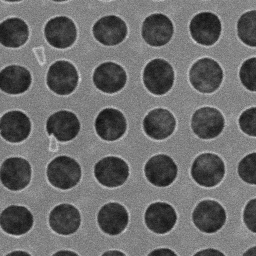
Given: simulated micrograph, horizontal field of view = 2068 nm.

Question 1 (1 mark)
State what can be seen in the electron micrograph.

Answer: a regular array of holes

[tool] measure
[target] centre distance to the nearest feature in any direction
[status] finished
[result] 46.8 pixels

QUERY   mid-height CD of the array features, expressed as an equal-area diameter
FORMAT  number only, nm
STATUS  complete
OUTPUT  267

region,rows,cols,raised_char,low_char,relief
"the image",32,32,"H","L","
HHHHHHHHHHHHHHHHHHHHHHHHHHHHHHHH
HHHHHHHHHHHHHHHHHHHHHHHHHHHHHHHL
HLLHHHLLLHHHLLLHHHLLLHHHLLLHHHLL
LLLHHHLLLLHHLLLLHHLLLLHHLLLLHHLL
LLLHHHLLLLHHLLLLHHLLLLHHLLLHHHLL
LLLHHHLLLHHHHLLHHHHLLHHHHLLHHHHL
HHHHHHHHHHHHHHHHHHHHHHHHHHHHHHHH
HHHHHHHHHHHHHHHHHHHLLHHHHLLHHHHL
HLLHHHLLLHHHLLLHHHLLLLHHLLLLHHLL
LLLLHHLLLLHHLLLLHHLLLLHHLLLLHHLL
LLLLHHLLLLHHLLLLHHLLLLHHLLLLHHLL
HLLHHHHLLHHHHLLHHHHLLHHHHLLHHHHH
HHHHHHHHHHHHHHHHHHHHHHHHHHHHHHHH
HHHHHHHHHHHHHHHHHHHHHHHHHLLHHHHL
LLLHHHLLLHHHLLLHHHLLLLHHLLLLHHLL
LLLLHHLLLLHHLLLLHHLLLLHHLLLLHHLL
LLLLHHLLLLHHLLLLHHLLLLHHLLLLHHLL
HLLHHHHLLHHHHLHHHHHHHHHHHHHHHHHH
HHHHHHHHHHHHHHHHHHHHHHHHHHHHHHHH
HHHHHHHLHHHHHHHHHHHLLHHHHLLHHHHL
LLLLHHLLLLHHLLLLHHLLLLHHLLLLHHLL
LLLLHHLLLLHHLLLLHHLLLLHHLLLLHHLL
LLLLHHLLLLHHLLLLHHLLLLHHLLLLHHLL
HLLHHHHLLHHHHHHHHHHHHHHHHHHHHHHH
HHHHHHHHHHHHHHHHHHHHHHHHHHHHHHHH
HHHHHHHHLHHHHLLHHHHLLHHHHLLHHHHL
LLLLHHLLLLHHLLLLHHLLLLHHLLLLHHLL
LLLLHHLLLLHHLLLLHHLLLLHHLLLLHHLL
LLLLHHLLLLHHHLLLHHHLLLHHHLLLHHHL
HHHHHHHHHHHHHHHHHHHHHHHHHHHHHHHH
HHHHHHHHHHHHHHHHHHHHHHHHHHHHHHHH
HHLHHHHLLHHHHLLHHHHLLLHHHLLLHHHL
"